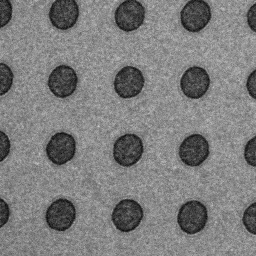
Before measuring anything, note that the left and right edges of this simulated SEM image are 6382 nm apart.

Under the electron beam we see a regular array of holes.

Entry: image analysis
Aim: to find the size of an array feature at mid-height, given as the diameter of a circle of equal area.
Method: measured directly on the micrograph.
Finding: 809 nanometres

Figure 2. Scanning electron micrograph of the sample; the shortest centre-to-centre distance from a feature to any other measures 1650 nm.